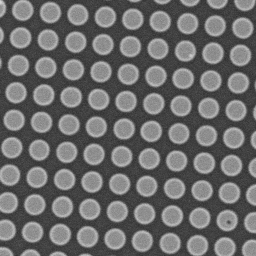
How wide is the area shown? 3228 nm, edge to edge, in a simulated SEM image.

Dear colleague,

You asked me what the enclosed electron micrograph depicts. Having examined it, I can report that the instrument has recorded an array of small figures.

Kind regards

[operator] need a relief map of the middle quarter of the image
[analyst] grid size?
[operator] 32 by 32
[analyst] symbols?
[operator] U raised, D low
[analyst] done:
UUUUUDDUUUUDDDUUUUDDDDDDDDDDDDDD
UUUUUDDUUUUUDDUUUUDDDUUUUDDDUUUD
UUUUUDDUUUUUDDUUUUUDUUUUUDDUUUUU
DUUUDDDUUUUDDDUUUUDDUUUUUDDUUUUU
DDDDDDDDDDDDDDUUUUDDDUUUUDDUUUUU
DDDDDDDDDDDDDDDDDDDDDDUUDDDDUUUU
UUUUDDDDUUDDDDDDDDDDDDDDDDDDDDDD
UUUUDDUUUUUDDDUUUDDDDDUDDDDDDDDD
UUUUDDUUUUUDDUUUUUDDUUUUUDDDUUUD
UUUUDDUUUUUDDUUUUUDDUUUUUDDUUUUU
DUUDDDDUUUUDDUUUUUDDUUUUUDDUUUUU
DDDDDDDDDDDDDDUUUDDDUUUUDDDUUUUU
DDDDDDDDDDDDDDDDDDDDDDUDDDDDUUUD
UUUDDDDUUDDDDDDDDDDDDDDDDDDDDDDD
UUUUDDUUUUDDDUUUUDDDDUUDDDDDDDDD
UUUUDDUUUUUDDUUUUDDDUUUUDDDUUUDD
UUUDDDUUUUDDDUUUUUDUUUUUDDUUUUUD
UUDDDDUUUUDDDUUUUDDUUUUUDDUUUUUD
DDDDDDDDDDDDDDUUDDDDUUUUDDUUUUUD
DDDDDDDDDDDDDDDDDDDDDDDDDDDUUUDD
UUUDDDUUUDDDDDDDDDDDDDDDDDDDDDDD
UUUDDUUUUUDDUUUUDDDDUUUDDDDDDDDD
UUUDDUUUUUDDUUUUUDDUUUUUDDUUUUDD
UUUDDUUUUUDDUUUUUDDUUUUUDDUUUUUD
UUDDDDUUUDDDUUUUUDDUUUUUDDUUUUUD
DDDDDDDDDDDDDUUDDDDUUUUDDDUUUUDD
UDDDDDDDDDDDDDDDDDDDDDDDDDDUUDDD
UUDDDUUUUDDDDDDDDDDDDDDDDDDDDDDD
UUUDDUUUUDDDUUUUDDDUUUDDDDDDDDDD
UUUDUUUUUUDUUUUUDDUUUUUDDDUUUUDD
UUDDDUUUUDDUUUUUDDUUUUUDDUUUUUDD
DDDDDUUUUDDDUUUUDDUUUUUDDUUUUUDD